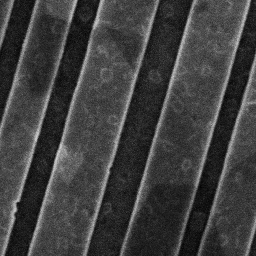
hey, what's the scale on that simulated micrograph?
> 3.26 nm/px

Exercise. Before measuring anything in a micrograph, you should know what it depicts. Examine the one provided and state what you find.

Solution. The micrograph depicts one or a few lines or trenches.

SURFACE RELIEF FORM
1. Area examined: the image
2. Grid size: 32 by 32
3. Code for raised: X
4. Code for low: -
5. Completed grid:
X----XXXX----XXXXXXX----XXXXXXX-
X---XXXXX---XXXXXXX-----XXXXXXX-
X---XXXXX---XXXXXXX-----XXXXXX--
X---XXXX----XXXXXXX----XXXXXXX--
---XXXXX---XXXXXXX-----XXXXXXX--
---XXXXX---XXXXXXX-----XXXXXXX--
---XXXXX---XXXXXXX----XXXXXXX---
---XXXX----XXXXXXX----XXXXXXX---
--XXXXX---XXXXXXX-----XXXXXXX---
--XXXXX---XXXXXXX-----XXXXXX---X
--XXXX----XXXXXXX----XXXXXXX---X
-XXXXX---XXXXXXX-----XXXXXXX---X
-XXXXX---XXXXXXX-----XXXXXXX--XX
-XXXXX---XXXXXXX-----XXXXXX---XX
-XXXX----XXXXXXX----XXXXXXX---XX
XXXXX---XXXXXXX-----XXXXXXX--XXX
XXXXX---XXXXXXX-----XXXXXX---XXX
XXXX----XXXXXXX----XXXXXXX---XXX
XXXX----XXXXXX-----XXXXXXX---XXX
XXXX---XXXXXXX-----XXXXXXX--XXXX
XXXX---XXXXXXX----XXXXXXX---XXXX
XXX----XXXXXXX----XXXXXXX---XXXX
XXX---XXXXXXX-----XXXXXXX---XXXX
XXX---XXXXXXX-----XXXXXX---XXXXX
XX----XXXXXXX----XXXXXXX---XXXXX
XX---XXXXXXX-----XXXXXXX---XXXXX
XX---XXXXXXX-----XXXXXXX--XXXXXX
XX---XXXXXXX----XXXXXXX---XXXXXX
X----XXXXXXX----XXXXXXX---XXXXXX
X---XXXXXXX-----XXXXXXX--XXXXXXX
X---XXXXXXX----XXXXXXX---XXXXXX-
X---XXXXXXX----XXXXXXX---XXXXXX-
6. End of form